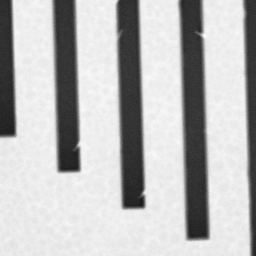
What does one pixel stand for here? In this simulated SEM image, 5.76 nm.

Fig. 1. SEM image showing parallel lines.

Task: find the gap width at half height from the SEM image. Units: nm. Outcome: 132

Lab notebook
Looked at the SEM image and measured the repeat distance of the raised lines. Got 366 nm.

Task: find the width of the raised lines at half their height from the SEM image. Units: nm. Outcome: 238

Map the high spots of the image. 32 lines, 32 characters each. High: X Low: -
--XXXXX--XXXXXX--XXXXX---XXXXX--
--XXXXX---XXXXX--XXXXX---XXXXXX-
--XXXXX---XXXXX--XXXXXX--XXXXXX-
--XXXXX---XXXXX--XXXXXX--XXXXX--
--XXXXX---XXXXX---XXXXX--XXXXXX-
--XXXXX---XXXXX---XXXXX--XXXXXX-
--XXXXX---XXXXX---XXXXX---XXXXX-
--XXXXX---XXXXX---XXXXX---XXXXX-
--XXXXX---XXXXX---XXXXX---XXXXX-
--XXXXX---XXXXX---XXXXX---XXXXX-
--XXXXX---XXXXX---XXXXX---XXXXX-
--XXXXX---XXXXX---XXXXX---XXXXX-
--XXXXX---XXXXX---XXXXX---XXXXX-
--XXXXX---XXXXX---XXXXX---XXXXX-
--XXXXX---XXXXX---XXXXX---XXXXX-
--XXXXX---XXXXX---XXXXX---XXXXX-
--XXXXX---XXXXX---XXXXX---XXXXX-
XXXXXXX---XXXXX---XXXXX---XXXXX-
XXXXXXX---XXXXX---XXXXX---XXXXX-
XXXXXXX---XXXXX---XXXXX---XXXXX-
XXXXXXX---XXXXX---XXXXX---XXXXX-
XXXXXXXX--XXXXX---XXXXX---XXXXX-
XXXXXXXXXXXXXXX---XXXXX---XXXXX-
XXXXXXXXXXXXXXX---XXXXX---XXXXX-
XXXXXXXXXXXXXXX---XXXXX---XXXXX-
XXXXXXXXXXXXXXX---XXXXX---XXXXX-
XXXXXXXXXXXXXXXXXXXXXXX---XXXXX-
XXXXXXXXXXXXXXXXXXXXXXX---XXXXX-
XXXXXXXXXXXXXXXXXXXXXXX---XXXXX-
XXXXXXXXXXXXXXXXXXXXXXX---XXXXX-
XXXXXXXXXXXXXXXXXXXXXXXXXXXXXXX-
XXXXXXXXXXXXXXXXXXXXXXXXXXXXXXX-